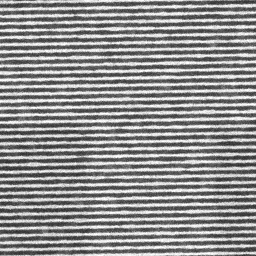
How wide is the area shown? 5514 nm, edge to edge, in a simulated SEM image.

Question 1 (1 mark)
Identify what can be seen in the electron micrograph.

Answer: parallel lines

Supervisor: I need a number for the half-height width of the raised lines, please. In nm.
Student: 32.3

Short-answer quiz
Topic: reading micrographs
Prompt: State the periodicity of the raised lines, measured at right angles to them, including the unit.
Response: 152 nanometers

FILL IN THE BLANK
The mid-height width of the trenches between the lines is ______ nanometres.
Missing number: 118